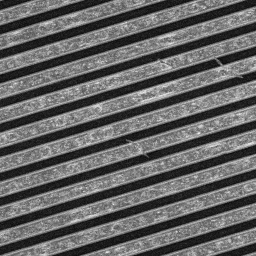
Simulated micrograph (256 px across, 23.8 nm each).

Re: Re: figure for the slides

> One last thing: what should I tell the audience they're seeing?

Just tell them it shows parallel lines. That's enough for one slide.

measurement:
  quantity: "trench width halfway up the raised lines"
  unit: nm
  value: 247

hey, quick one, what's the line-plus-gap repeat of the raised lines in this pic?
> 558 nanometres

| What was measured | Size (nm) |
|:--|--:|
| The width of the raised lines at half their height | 330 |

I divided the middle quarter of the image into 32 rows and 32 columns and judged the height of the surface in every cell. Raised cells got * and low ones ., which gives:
***********.........***********.
*******..........***********....
****.........***********........
*.........***********.........**
.......***********.........*****
...***********..........********
***********.........***********.
********.........***********....
*****.........***********.......
*.........************.........*
.......***********.........*****
....***********.........********
************.........***********
********.........************...
*****.........***********.......
**.........***********.........*
.......************.........****
....***********.........********
.***********.........***********
*********.......*.***********...
*****.........************......
**.........***********.........*
........***********.........****
.....***********.........*******
.***********.........***********
*********.........***********...
******.........***********......
**..........***********.........
........***********.........****
.....***********.........*******
..***********.........**********
*********..........***********..